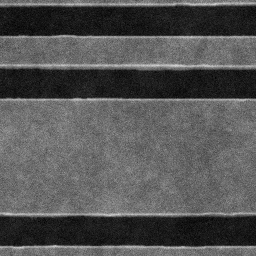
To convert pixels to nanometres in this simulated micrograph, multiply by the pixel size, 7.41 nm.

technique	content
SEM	lines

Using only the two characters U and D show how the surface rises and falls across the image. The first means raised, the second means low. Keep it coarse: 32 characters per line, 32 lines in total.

UUUUUUUUUUUUUUUUUUUUUUUUUUUUDDDD
DDDDDDDDDDDDDDDDDDDDDDDDDDDDDDDD
DDDDDDDDDDDDDDDDDDDDDDDDDDDDDDDD
DDDDDDDDDDDDDDDDDDDDDDDDDDDDDDDD
DDDDDDDUUUDDDDDDDDDDDDDDDDDDDDDD
UUUUUUUUUUUUUUUUUUUUUUUUUUUUUUUU
UUUUUUUUUUUUUUUUUUUUUUUUUUUUUUUU
UUUUUUUUUUUUUUUUUUUUUUUUUUUUUUUU
DDDDDDDDDDDDDDDDDDDDDDDDDDDDDDDD
DDDDDDDDDDDDDDDDDDDDDDDDDDDDDDDD
DDDDDDDDDDDDDDDDDDDDDDDDDDDDDDDD
DDDDDDDDDDDDDDDDDDDDDDDDDDDDDDDD
UUUUUUUUUUUUUUUUUUUUUUUUUUUUUUUU
UUUUUUUUUUUUUUUUUUUUUUUUUUUUUUUU
UUUUUUUUUUUUUUUUUUUUUUUUUUUUUUUU
UUUUUUUUUUUUUUUUUUUUUUUUUUUUUUUU
UUUUUUUUUUUUUUUUUUUUUUUUUUUUUUUU
UUUUUUUUUUUUUUUUUUUUUUUUUUUUUUUU
UUUUUUUUUUUUUUUUUUUUUUUUUUUUUUUU
UUUUUUUUUUUUUUUUUUUUUUUUUUUUUUUU
UUUUUUUUUUUUUUUUUUUUUUUUUUUUUUUU
UUUUUUUUUUUUUUUUUUUUUUUUUUUUUUUU
UUUUUUUUUUUUUUUUUUUUUUUUUUUUUUUU
UUUUUUUUUUUUUUUUUUUUUUUUUUUUUUUU
UUUUUUUUUUUUUUUUUUUUUUUUUUUUUUUU
UUUUUUUUUUUUUUUUUUUUUUUUUUUUUUUU
UUUUUUUUUUUUUUUUUUUUUUUUUUUUUUUU
DDDDDDDDDDDDDDDDDDDDDDDDDDDDDDDD
DDDDDDDDDDDDDDDDDDDDDDDDDDDDDDDD
DDDDDDDDDDDDDDDDDDDDDDDDDDDDDDDD
DDDDDDDDDDDDDDDDDDDDDDDDDDDDDDDD
UUUUUUUUUUUUUUUUUUUUUUUUUUUUUUUU